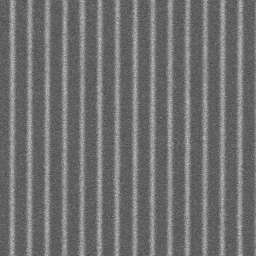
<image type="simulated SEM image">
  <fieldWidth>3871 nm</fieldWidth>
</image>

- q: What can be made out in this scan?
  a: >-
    parallel lines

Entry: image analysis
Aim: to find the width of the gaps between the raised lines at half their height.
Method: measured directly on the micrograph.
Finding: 217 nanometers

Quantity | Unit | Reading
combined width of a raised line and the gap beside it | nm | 265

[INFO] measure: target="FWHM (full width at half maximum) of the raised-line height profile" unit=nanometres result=51